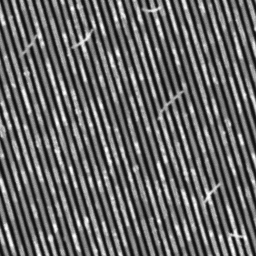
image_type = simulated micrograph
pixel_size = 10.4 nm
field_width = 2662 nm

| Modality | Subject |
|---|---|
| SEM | parallel lines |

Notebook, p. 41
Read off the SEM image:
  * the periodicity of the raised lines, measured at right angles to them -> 81.1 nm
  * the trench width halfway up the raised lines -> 37.4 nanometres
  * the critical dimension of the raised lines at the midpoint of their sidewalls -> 37.4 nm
